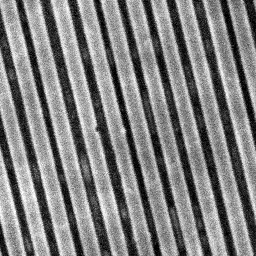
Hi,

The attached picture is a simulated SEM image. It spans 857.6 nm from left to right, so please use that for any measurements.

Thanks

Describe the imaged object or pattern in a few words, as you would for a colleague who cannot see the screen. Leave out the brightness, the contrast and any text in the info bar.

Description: parallel lines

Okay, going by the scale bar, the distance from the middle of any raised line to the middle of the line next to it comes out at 82.7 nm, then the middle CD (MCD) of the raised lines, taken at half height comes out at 49.7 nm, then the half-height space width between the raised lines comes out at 32.9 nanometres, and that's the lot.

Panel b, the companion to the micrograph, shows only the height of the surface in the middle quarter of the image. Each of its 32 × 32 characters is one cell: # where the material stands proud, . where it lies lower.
.####..####..####...###...###...
.####...###..####...####..####..
.####...####..###...####..####..
..###...####..####..####..####..
..####..####..####...###...###..
..####...###..####...####..####.
..####...####..###...####..####.
...###...####..####..####..####.
...###...####..####...###...###.
...####...###..####...###...####
...####...####..####..####..####
...####...####..####..####..####
#...###...####..####..####...###
#...####...###..####...###...###
#...####...####..####..####..###
#...####...####..####..####..###
##...###...####..####..####...##
##...####...###..####...###...##
##...####...###...####..####..##
##...####...####..####..####..##
###...###...####..####..####..##
###...####...###..####...###...#
###...####...###..#####..####..#
###...####...####..####..####..#
####...###...####..####..####..#
####...####..####..####...###...
####...####...###...####..####..
####...####...####..####..####..
.###....###...####..####..####..
.####...####..####..####...###..
.####...####...###..####...####.
.####...####...####..####..####.